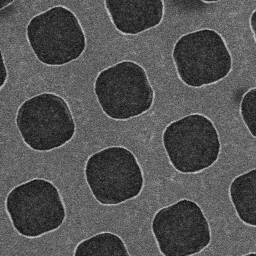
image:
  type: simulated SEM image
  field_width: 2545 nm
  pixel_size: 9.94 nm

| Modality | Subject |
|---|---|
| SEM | holes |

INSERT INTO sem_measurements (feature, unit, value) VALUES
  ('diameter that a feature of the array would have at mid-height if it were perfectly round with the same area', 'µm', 0.565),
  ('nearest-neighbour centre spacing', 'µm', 0.839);